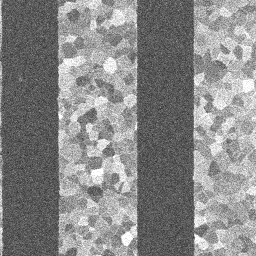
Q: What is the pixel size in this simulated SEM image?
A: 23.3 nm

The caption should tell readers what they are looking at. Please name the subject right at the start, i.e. one or a few lines or trenches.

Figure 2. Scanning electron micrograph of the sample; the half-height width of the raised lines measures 1800 nanometres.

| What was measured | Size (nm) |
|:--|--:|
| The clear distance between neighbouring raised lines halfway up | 1350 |